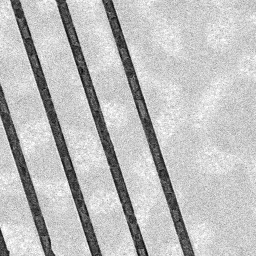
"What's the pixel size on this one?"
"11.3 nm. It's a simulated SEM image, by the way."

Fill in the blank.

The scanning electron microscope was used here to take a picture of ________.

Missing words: parallel lines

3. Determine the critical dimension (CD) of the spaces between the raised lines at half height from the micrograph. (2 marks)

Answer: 0.114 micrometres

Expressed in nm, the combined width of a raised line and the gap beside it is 498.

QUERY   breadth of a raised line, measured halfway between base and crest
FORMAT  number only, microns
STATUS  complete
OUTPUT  0.385